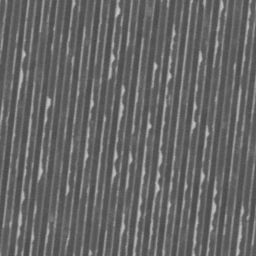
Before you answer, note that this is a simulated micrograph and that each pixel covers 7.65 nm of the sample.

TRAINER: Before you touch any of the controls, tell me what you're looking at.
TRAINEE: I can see parallel lines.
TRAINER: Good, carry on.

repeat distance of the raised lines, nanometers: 112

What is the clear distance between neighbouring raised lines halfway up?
49.4 nanometers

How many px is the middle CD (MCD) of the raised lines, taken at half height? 8.58